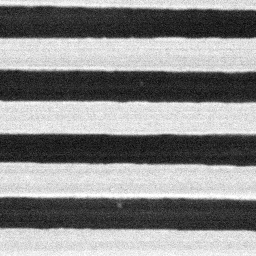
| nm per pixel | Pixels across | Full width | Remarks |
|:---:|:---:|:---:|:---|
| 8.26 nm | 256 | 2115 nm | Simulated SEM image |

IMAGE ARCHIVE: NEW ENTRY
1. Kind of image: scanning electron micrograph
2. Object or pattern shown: lines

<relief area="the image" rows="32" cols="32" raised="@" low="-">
@@@@@@@@@@@@@@@@@@@@@@@@@@@@@@@@
--------------------------------
--------------------------------
--------------------------------
--------------------------------
@@@@@@@@@@@@@@@@@@@@@@@@@@@@@@@@
@@@@@@@@@@@@@@@@@@@@@@@@@@@@@@@@
@@@@@@@@@@@@@@@@@@@@@@@@@@@@@@@@
@@@@@@@@@@@@@@@@@@@@@@@@@@@@@@@@
--------------------------------
--------------------------------
--------------------------------
--------------------------------
@@@@@@@@@@@@@@@@@@@@@@@@@@@@@@@@
@@@@@@@@@@@@@@@@@@@@@@@@@@@@@@@@
@@@@@@@@@@@@@@@@@@@@@@@@@@@@@@@@
@@@@@@@@@@@@@@@@@@@@@@@@@@@@@@@@
--------------------------------
--------------------------------
--------------------------------
@@@@@---------------------------
@@@@@@@@@@@@@@@@@@@@@@@@@@@@@@@@
@@@@@@@@@@@@@@@@@@@@@@@@@@@@@@@@
@@@@@@@@@@@@@@@@@@@@@@@@@@@@@@@@
@@@@@@@@@@@@@@@@@@@@@@@@@@@@@@@@
--------------------------------
--------------------------------
--------------------------------
--------------------------------
@@@@@@@@@@@@@@@@@@@@@@@@@@@@@@@@
@@@@@@@@@@@@@@@@@@@@@@@@@@@@@@@@
@@@@@@@@@@@@@@@@@@@@@@@@@@@@@@@@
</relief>